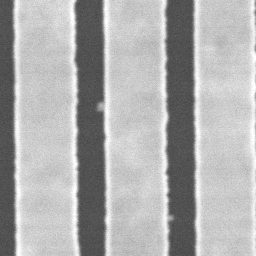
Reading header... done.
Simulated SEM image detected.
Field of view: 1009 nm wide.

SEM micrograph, lines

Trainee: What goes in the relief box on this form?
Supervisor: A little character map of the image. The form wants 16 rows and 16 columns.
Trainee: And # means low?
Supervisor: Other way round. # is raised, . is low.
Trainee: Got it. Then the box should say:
.####..###..####
.####..###..####
.####..###..####
.####..###..####
.####..###..####
.####..###..####
.####..###..####
.####..###..####
.####..###..####
.####..###..####
.####..###..####
.####..###..####
.####..###..####
.####..###..####
.####..####.####
.####..####.####